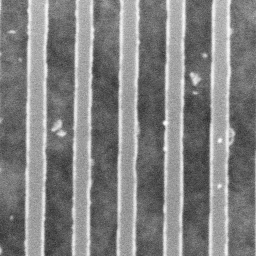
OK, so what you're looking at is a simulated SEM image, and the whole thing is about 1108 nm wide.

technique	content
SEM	lines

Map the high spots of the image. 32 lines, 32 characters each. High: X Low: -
----XX----X----XX----XX----XX---
----XX---XX----XX----XX----XX---
----XX----X----XX----XX----XX---
----XX----XX---XX----XX----XX---
----XX----XX---XX----XX----XX---
----XX---XX----XX----XX----XX---
----XX---XX----XX----XX----XX---
----XX---XX----XX----XX----XX---
----XX---XX----XX----XX---XXX---
----XX---XX----XX----XX---XXX---
----XX---XX----XX----XX---XXX---
----XX---XX----XX----XX---XX----
----XX---XX----XX----XX---XX----
---XXX---XX----XX----XX---XX----
---XXX---XX----XX----XX---XX----
---XXX---XX----XX----XX---XX----
---XXX---XX----XX----XX---XX----
---XXX---XX----XX----XX---XX----
---XXX---XX----XX----XX---XX----
---XXX---XX----XX----XX---XX----
---XXX---XX----XX----XX---XX----
---XXX---XX----XX----XX---XX----
---XXX---XX----XX----XX---XX----
---XXX---XX----XX----XX---XX----
---XXX---XX----XX----XX---XX----
---XXX---XX----XX----XX---XX----
---XXX---XX----XX----XX---XX----
---XXX---XX----XX----XX---XX----
---XX----XX----XX----XX---XX----
---XX----XX----XX----XX---XX----
---XX----XX----XX----XX---XX----
---XX----XX----XX----XX---XX----